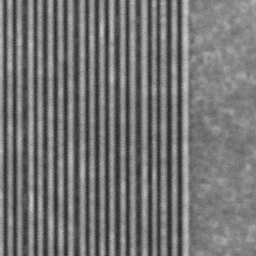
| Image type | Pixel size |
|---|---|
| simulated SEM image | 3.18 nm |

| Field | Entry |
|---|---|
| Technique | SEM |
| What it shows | parallel lines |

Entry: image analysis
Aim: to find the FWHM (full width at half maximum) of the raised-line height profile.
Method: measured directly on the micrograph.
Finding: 16.3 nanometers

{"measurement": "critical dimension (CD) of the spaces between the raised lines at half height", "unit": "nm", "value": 15.9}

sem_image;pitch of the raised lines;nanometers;32.7